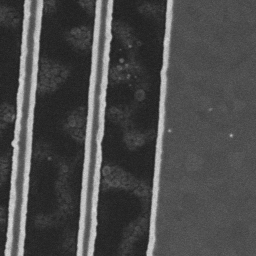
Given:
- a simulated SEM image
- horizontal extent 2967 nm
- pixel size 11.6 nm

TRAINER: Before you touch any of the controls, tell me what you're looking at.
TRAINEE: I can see one or a few lines or trenches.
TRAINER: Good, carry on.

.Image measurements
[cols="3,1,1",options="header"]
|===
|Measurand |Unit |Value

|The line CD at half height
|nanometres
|154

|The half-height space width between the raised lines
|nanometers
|668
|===